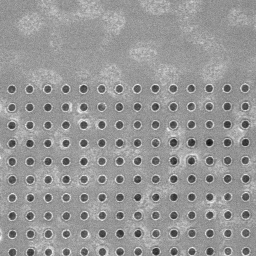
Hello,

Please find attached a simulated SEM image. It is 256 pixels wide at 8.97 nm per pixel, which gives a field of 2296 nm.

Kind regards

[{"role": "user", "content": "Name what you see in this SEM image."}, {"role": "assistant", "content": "a regular array of raised bodies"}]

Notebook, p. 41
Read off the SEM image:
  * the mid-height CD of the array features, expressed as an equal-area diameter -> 77.7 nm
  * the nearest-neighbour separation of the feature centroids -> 160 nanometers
